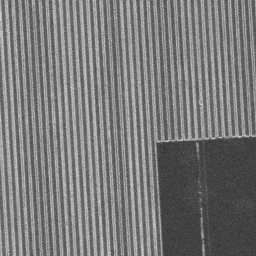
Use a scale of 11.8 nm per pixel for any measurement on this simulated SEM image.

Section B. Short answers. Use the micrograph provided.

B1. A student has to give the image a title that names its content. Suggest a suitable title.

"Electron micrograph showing parallel lines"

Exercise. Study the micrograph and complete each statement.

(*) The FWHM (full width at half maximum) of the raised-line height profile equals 0.0235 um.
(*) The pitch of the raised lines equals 79.3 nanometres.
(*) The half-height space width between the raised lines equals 3.99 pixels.